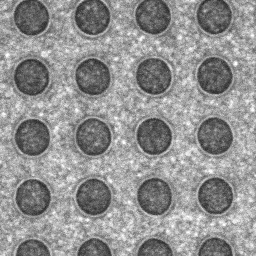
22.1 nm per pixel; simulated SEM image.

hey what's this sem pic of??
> a regular array of holes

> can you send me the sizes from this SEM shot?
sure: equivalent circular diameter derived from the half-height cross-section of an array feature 820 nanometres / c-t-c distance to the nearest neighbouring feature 1.33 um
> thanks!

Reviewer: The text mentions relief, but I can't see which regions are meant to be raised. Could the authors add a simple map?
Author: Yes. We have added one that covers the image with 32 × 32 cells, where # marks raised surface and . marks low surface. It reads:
##...#####...####....####...####
##....###.....###....####....###
##....###.....###....####....###
##....####...####....####....###
################################
################################
################################
###..#####...#####..#####...####
##....####....###....####....###
##....###.....###.....###....###
##....####....###....####....###
###..#####...#####...#####..####
################################
################################
################################
###...####...#####...####....###
##....###.....###....####....###
##....###.....###....####....###
##....####....####...####....###
####.###########################
################################
################################
###..######..#####..######..####
##....####....###....####....###
##....###.....###.....###....###
##....####....###....####....###
###...####...#####...#####..####
################################
################################
################################
###...####...#####...####....###
##....####....###.....###....###